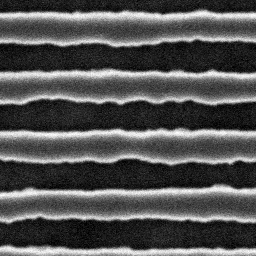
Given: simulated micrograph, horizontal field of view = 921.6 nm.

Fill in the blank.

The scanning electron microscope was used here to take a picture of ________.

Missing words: lines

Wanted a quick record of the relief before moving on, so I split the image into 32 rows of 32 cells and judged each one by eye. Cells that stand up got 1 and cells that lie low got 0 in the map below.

00000000000000000000000000000000
00000000000000000000000000000000
11111111111111111111111111111111
11111111111111111111111111111111
11111111111111111111111111111111
00000001100001111100000000000000
00000000000000000000000000000000
00000000000000000000000000000000
00000000000000000000000000000000
11111111111111111111111111111111
11111111111111111111111111111111
11111111111111111111111111111111
11110000011111111011111011111111
00000000000000000000000000000000
00000000000000000000000000000000
00000000000000000000000000000000
00110000000111110001111011111100
11111111111111111111111111111111
11111111111111111111111111111111
11111111111111111111111111111111
00000000000000000000010000000000
00000000000000000000000000000000
00000000000000000000000000000000
00000000000000000000000000100000
11111111111111111111111111111111
11111111111111111111111111111111
11111111111111111111111111111111
11000000000001000000001011001111
00000000000000000000000000000000
00000000000000000000000000000000
00000000000000000000000000000000
11111111111111111111111111111111